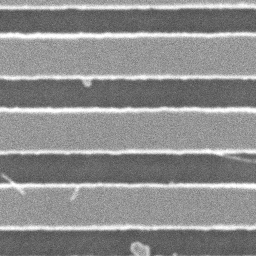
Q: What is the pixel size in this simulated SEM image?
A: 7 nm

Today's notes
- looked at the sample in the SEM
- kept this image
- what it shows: lines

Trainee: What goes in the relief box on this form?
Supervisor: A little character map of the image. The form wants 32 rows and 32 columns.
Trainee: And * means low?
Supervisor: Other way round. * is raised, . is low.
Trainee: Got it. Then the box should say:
********************************
................................
................................
................................
********************************
********************************
********************************
********************************
********************************
********************************
................................
................................
................................
................................
********************************
********************************
********************************
********************************
********************************
................................
................................
................................
................................
********************************
********************************
********************************
********************************
********************************
********************************
................................
................................
................................